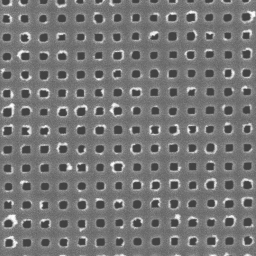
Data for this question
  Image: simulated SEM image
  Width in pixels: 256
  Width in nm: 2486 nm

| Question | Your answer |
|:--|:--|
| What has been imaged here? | a regular array of holes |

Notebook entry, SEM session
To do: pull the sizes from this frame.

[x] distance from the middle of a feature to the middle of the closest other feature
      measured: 175 nanometers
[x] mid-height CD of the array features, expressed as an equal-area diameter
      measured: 84.2 nanometres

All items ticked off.